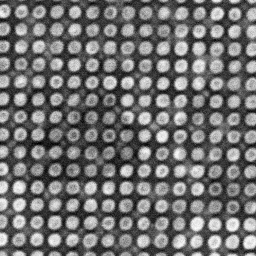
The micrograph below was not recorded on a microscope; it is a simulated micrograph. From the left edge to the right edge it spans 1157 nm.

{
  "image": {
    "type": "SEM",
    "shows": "a regular array of raised bodies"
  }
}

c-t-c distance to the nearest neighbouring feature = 78.7 nm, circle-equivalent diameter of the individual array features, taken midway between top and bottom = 51.5 nm